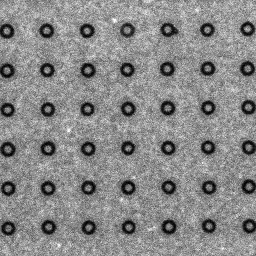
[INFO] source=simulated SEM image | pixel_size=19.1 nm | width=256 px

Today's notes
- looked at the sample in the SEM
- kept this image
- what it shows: a regular array of ring-shaped grooves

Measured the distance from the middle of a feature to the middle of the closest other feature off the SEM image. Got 744 nanometers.